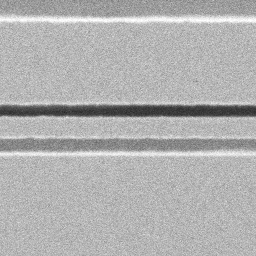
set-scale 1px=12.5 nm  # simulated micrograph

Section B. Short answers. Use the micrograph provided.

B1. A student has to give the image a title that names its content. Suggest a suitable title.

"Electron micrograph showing lines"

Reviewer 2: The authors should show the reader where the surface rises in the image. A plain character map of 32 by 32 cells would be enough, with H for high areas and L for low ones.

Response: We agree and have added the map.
LLLLLLLLLLLLLLLLLLLLLLLLLLLLLLLL
LLLLLLLLLLLLLLLLLLLLLLLLLLLLLLLL
HHHHHHHHHHHHHLHHHHHHHHHHHHHHHHHH
HHHHHHHHHHHHHHHHHHHHHHHHHHHHHHHH
HHHHHHHHHHHHHHHHHHHHHHHHHHHHHHHH
HHHHHHHHHHHHHHHHHHHHHHHHHHHHHHHH
HHHHHHHHHHHHHHHHHHHHHHHHHHHHHHHH
HHHHHHHHHHHHHHHHHHHHHHHHHHHHHHHH
HHHHHHHHHHHHHHHHHHHHHHHHHHHHHHHH
HHHHHHHHHHHHHHHHHHHHHHHHHHHHHHHH
HHHHHHHHHHHHHHHHHHHHHHHHHHHHHHHH
HHHHHHHHHHHHHHHHHHHHHHHHHHHHHHHH
HHHHHHHHHHHHHHHHHHHHHHHHHHHHHHHH
LLLLLLLLLLLLLLLLLLLLLLLLLLLLLLLL
LLLLLLLLLLLLLLLLLLLLLLLLLLLLLLLL
HHHHHHHHHHHHHHHHHHHHHHHHHHHHHHHH
HHHHHHHHHHHHHHHHHHHHHHHHHHHHHHHH
LLLLLLLLLLLLLLLLLLLLLLLLLLLLLLLL
LLLLLLLLLLLLLLLLLLLLLLLLLLLLLLLL
HHHHHHHHHHHHHHHHHHHHHHHHHHHHHHHH
HHHHHHHHHHHHHHHHHHHHHHHHHHHHHHHH
HHHHHHHHHHHHHHHHHHHHHHHHHHHHHHHH
HHHHHHHHHHHHHHHHHHHHHHHHHHHHHHHH
HHHHHHHHHHHHHHHHHHHHHHHHHHHHHHHH
HHHHHHHHHHHHHHHHHHHHHHHHHHHHHHHH
HHHHHHHHHHHHHHHHHHHHHHHHHHHHHHHH
HHHHHHHHHHHHHHHHHHHHHHHHHHHHHHHH
HHHHHHHHHHHHHHHHHHHHHHHHHHHHHHHH
HHHHHHHHHHHHHHHHHHHHHHHHHHHHHHHH
HHHHHHHHHHHHHHHHHHHHHHHHHHHHHHHH
HHHHHHHHHHHHHHHHHHHHHHHHHHHHHHHH
HHHHHHHHHHHHHHHHHHHHHHHHHHHHHHHH